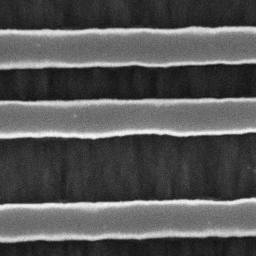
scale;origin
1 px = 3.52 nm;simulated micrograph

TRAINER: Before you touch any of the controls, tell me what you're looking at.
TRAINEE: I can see lines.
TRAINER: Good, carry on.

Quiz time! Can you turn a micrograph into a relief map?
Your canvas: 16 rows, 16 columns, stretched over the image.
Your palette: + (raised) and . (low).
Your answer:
................
................
++++++++++++++++
++++++++++++++++
................
................
++++++++++++++++
++++++++++++++++
+++++++.........
................
................
................
...........+...+
++++++++++++++++
++++++++++++++++
................